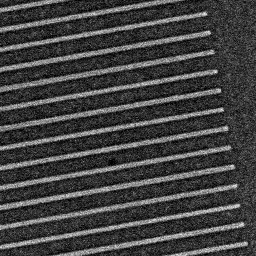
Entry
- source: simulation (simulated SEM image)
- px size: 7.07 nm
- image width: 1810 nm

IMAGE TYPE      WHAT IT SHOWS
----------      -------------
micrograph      parallel lines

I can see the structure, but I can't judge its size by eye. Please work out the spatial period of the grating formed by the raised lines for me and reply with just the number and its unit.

138 nanometers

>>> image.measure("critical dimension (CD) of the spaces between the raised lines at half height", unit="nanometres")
109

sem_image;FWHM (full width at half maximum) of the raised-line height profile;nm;26.2